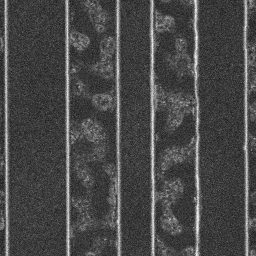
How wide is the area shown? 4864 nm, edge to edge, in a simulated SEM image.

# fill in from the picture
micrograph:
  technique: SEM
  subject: one or a few lines or trenches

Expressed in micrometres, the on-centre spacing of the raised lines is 1.75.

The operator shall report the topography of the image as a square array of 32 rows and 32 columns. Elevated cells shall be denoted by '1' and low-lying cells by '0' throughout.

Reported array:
01111111000000011110000011111110
01111111000000011110000011111110
01111111000000011110000011111110
01111111000000011110000011111110
01111111000000011110000001111110
01111111000000011110000001111110
01111111000000011110000011111110
01111111000000011110000011111110
01111111000000011110000011111110
01111111000000011110000011111110
01111111000000011110000001111110
01111111000000011110000001111110
01111111100000011110000001111110
01111111000000011110000001111110
01111111100000011110000001111110
01111111000000011110000001111110
01111111000000011110000001111110
01111111000000011110000001111110
01111111100000011110000001111110
01111111100000011110000001111110
01111111100000011110000001111110
01111111100000011110000001111110
01111111000000011110000001111110
01111111000000011110000001111110
01111111000000011110000001111110
01111111000000011110000001111110
01111111100000011110000001111110
01111111100000011110000001111110
01111111100000011110000001111110
01111111000000011110000001111110
01111111000000011110000001111110
01111111000000011110000001111110